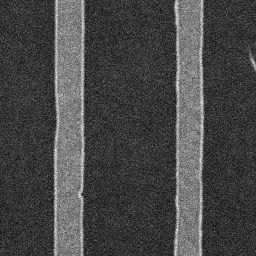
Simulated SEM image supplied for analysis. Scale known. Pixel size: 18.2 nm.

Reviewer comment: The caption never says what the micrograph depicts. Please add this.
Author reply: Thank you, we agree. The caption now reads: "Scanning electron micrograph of one or a few lines or trenches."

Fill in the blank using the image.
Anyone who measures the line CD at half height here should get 0.458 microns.